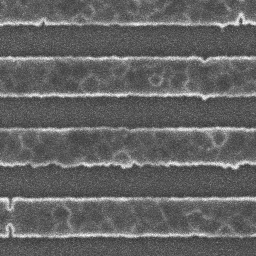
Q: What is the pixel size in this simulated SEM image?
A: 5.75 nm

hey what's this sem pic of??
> one or a few lines or trenches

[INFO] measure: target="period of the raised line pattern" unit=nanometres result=404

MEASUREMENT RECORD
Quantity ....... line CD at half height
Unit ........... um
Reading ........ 0.22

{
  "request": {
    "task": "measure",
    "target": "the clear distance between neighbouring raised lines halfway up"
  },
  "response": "0.186 microns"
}